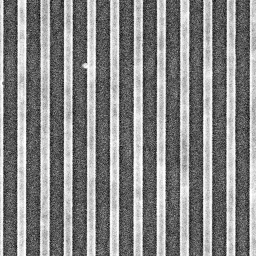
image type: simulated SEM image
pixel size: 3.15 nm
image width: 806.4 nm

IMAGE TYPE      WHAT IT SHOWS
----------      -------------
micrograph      parallel lines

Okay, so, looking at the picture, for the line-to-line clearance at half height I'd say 50.4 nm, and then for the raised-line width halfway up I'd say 24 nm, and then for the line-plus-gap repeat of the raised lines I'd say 73.3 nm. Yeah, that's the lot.